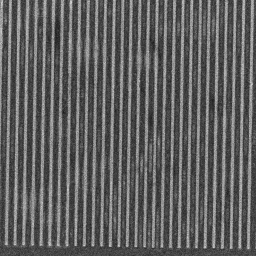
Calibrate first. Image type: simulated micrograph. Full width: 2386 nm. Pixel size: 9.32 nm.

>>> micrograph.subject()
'parallel lines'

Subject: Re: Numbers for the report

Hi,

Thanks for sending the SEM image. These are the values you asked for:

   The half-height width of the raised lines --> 18.6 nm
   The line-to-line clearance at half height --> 0.0629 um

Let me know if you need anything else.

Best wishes